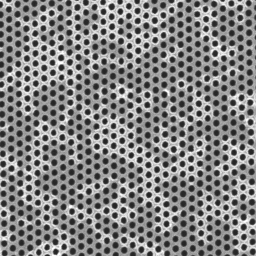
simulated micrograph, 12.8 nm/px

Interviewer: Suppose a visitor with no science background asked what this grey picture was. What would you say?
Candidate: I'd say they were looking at a regular array of holes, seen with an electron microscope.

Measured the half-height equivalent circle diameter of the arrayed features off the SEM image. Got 87.8 nm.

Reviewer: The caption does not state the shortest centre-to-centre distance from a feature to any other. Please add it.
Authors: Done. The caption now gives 124 nanometres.